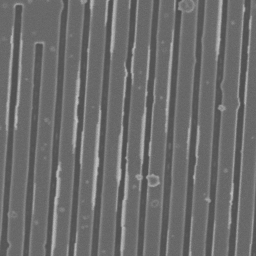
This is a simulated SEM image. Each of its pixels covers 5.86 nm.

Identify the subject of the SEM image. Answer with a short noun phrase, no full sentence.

parallel lines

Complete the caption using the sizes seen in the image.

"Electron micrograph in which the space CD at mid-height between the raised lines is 35.1 nm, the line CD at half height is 99.5 nm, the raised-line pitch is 134 nm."